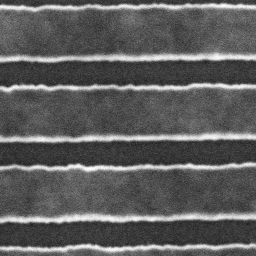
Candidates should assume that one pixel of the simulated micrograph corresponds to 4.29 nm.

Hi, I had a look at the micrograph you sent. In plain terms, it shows lines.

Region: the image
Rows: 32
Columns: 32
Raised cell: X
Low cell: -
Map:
--------------------------------
XXXXXXXXXXXXXXXXXXXXXXXXXXXXXXXX
XXXXXXXXXXXXXXXXXXXXXXXXXXXXXXXX
XXXXXXXXXXXXXXXXXXXXXXXXXXXXXXXX
XXXXXXXXXXXXXXXXXXXXXXXXXXXXXXXX
XXXXXXXXXXXXXXXXXXXXXXXXXXXXXXXX
XXXXXXXXXXXXXXXXXXXXXXXXXXXXXXXX
XX-XXXXX------------------------
--------------------------------
--------------------------------
--------------------------------
XXXXXXXXXXXXXXXXXXXXXXXXXXXXXXXX
XXXXXXXXXXXXXXXXXXXXXXXXXXXXXXXX
XXXXXXXXXXXXXXXXXXXXXXXXXXXXXXXX
XXXXXXXXXXXXXXXXXXXXXXXXXXXXXXXX
XXXXXXXXXXXXXXXXXXXXXXXXXXXXXXXX
XXXXXXXXXXXXXXXXXXXXXXXXXXXXXXXX
XXXXXXXXXXX---------------------
--------------------------------
--------------------------------
-------------------------------X
XXXXXXXXXXXXXXXXXXXXXXXXXXXXXXXX
XXXXXXXXXXXXXXXXXXXXXXXXXXXXXXXX
XXXXXXXXXXXXXXXXXXXXXXXXXXXXXXXX
XXXXXXXXXXXXXXXXXXXXXXXXXXXXXXXX
XXXXXXXXXXXXXXXXXXXXXXXXXXXXXXXX
XXXXXXXXXXXXXXXXXXXXXXXXXXXXXXXX
XXXXXXXXX-----XX----X-----------
--------------------------------
--------------------------------
--------------------------------
XXXXXXXXXXXXXXXXXXXXXXXXXXXXXXXX